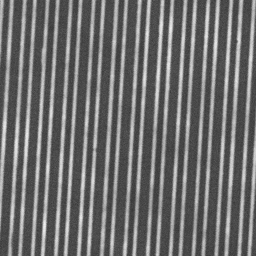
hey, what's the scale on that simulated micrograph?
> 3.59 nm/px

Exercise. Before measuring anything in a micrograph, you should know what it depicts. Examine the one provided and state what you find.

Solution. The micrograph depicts parallel lines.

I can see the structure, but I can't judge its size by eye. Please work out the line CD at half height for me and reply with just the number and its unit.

0.0121 micrometres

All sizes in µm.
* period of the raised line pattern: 0.0411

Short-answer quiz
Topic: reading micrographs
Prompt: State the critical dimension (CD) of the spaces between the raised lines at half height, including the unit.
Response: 31.8 nm